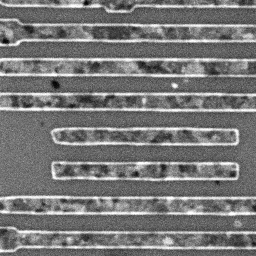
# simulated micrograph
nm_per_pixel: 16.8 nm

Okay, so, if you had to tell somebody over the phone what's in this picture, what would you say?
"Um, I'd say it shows wiring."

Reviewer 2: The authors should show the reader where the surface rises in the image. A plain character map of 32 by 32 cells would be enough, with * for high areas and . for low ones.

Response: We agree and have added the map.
********************************
................................
**..............................
********************************
********************************
**..............................
................................
****************************....
********************************
................................
................................
................................
********************************
********************************
................................
................................
.......***********************..
.......***********************..
................................
................................
.......**********************...
.......***********************..
................................
................................
................................
********************************
********************************
................................
**..............................
********************************
********************************
................................